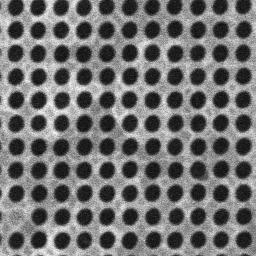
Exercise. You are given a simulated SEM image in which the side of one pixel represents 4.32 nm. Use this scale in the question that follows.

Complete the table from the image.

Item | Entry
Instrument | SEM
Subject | a regular array of holes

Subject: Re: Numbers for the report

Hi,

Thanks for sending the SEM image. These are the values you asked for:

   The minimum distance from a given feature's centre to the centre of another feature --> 97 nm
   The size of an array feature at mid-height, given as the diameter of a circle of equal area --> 0.0769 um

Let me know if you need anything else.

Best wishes